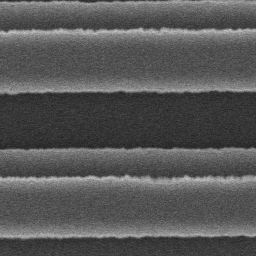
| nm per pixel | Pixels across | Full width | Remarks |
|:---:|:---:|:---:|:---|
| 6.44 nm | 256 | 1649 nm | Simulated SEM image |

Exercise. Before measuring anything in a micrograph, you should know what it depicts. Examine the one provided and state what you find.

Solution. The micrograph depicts lines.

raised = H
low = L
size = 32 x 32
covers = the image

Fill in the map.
HHHHHHHHHHHLHHHHHHHHHHHHHHHHHHHH
HHHHHHHHHHHHHHHHHHHHHHHHHHHHHHHH
HHHHHHHHHHHHHHHHHHHHHHHHHHHHHHHH
HHHHHHHHHHHHHHHHHHHHHHHHHHHHHHHH
HHHHHHHHHHHHHHHHHHHHHHHHHHHHHHHH
HHHHHHHHHHHHHHHHHHHHHHHHHHHHHHHH
HHHHHHHHHHHHHHHHHHHHHHHHHHHHHHHH
HHHHHHHHHHHHHHHHHHHHHHHHHHHHHHHH
HHHHHHHHHHHHHHHHHHHHHHHHHHHHHHHH
HHHHHHHHHHHHHHHHHHHHHHHHHHHHHHHH
HHHHHHHHHHHHHHHHHHHHHHHHHHHHHHHH
LHLLLLLLLLLLLLLLLLLLLLLLLLLLLLLL
LLLLLLLLLLLLLLLLLLLLLLLLLLLLLLLL
LLLLLLLLLLLLLLLLLLLLLLLLLLLLLLLL
LLLLLLLLLLLLLLLLLLLLLLLLLLLLLLLL
LLLLLLLLLLLLLLLLLLLLLLLLLLLLLLLL
LLLLLLLLLLLLLLLLLLLLLLLLLLLLLLLL
LLLLLLLLLLLLLLLLLLLLLLLLLLLLLLLL
LLLLLLLLLLLLLLLLLLLLLLLLLLLLLLLL
HHHHHHHHHHHHHHHHHHHHHHHHHHHHHHHH
HHHHHHHHHHHHHHHHHHHHHHHHHHHHHHHH
HHHHHHHHHHHHHHHHHHHHHHHHHHHHHHHH
HHHHHHHHHHHHHHHHHHHHHHHHHHHHHHHH
HHHHHHHHHHHHHHHHHHHHHHHHHHHHHHHH
HHHHHHHHHHHHHHHHHHHHHHHHHHHHHHHH
HHHHHHHHHHHHHHHHHHHHHHHHHHHHHHHH
HHHHHHHHHHHHHHHHHHHHHHHHHHHHHHHH
HHHHHHHHHHHHHHHHHHHHHHHHHHHHHHHH
HHHHHHHHHHHHHHHHHHHHHHHHHHHHHHHH
LLHHLLLHLLLLLLLLLLLLLLLLLLLLLLLL
LLLLLLLLLLLLLLLLLLLLLLLLLLLLLLLL
LLLLLLLLLLLLLLLLLLLLLLLLLLLLLLLL